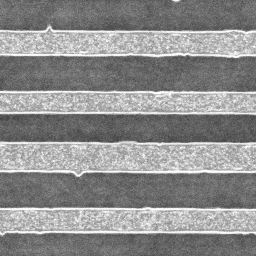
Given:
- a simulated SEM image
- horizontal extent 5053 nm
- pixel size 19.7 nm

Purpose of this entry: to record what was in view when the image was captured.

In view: parallel lines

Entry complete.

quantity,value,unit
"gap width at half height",0.721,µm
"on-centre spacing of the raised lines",1170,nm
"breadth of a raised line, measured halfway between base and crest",469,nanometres